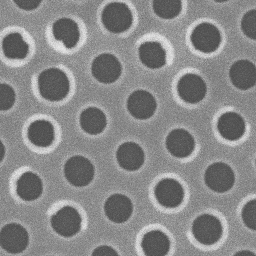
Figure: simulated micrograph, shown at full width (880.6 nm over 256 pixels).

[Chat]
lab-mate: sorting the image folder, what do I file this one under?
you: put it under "a regular array of holes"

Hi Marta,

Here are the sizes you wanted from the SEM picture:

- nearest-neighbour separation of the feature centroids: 0.177 µm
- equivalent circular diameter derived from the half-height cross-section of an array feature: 105 nm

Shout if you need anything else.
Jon